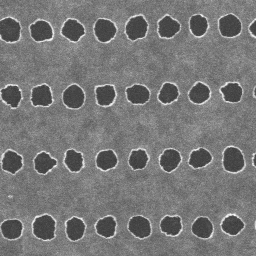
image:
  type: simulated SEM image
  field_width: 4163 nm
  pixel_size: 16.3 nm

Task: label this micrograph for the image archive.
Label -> a regular array of holes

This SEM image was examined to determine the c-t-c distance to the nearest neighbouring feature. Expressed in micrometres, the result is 0.506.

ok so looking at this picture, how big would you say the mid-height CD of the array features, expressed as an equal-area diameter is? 346 nm